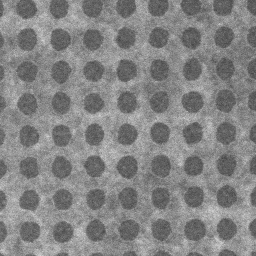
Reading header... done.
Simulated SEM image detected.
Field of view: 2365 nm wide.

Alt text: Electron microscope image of a regular array of raised bodies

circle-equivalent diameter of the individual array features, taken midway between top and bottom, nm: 211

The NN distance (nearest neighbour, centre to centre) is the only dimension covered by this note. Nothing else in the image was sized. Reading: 294 nm